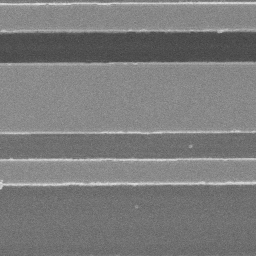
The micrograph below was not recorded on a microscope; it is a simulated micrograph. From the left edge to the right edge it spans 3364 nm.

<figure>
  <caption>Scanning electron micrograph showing lines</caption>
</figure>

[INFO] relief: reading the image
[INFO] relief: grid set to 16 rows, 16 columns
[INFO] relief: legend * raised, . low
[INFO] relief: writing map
****************
****************
................
................
****************
****************
****************
****************
****************
****************
****************
*...............
................
................
................
................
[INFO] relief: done